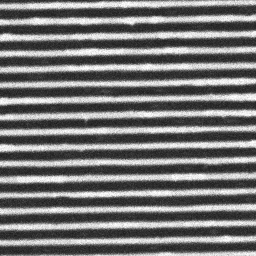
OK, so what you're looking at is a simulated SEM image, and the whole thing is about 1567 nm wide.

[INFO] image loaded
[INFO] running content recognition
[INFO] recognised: parallel lines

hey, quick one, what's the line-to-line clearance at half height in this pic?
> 61.2 nm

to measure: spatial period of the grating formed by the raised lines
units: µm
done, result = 0.0965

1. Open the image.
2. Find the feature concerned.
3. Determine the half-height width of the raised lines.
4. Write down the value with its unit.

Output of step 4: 36.7 nanometres